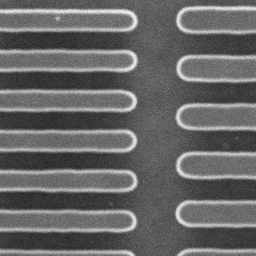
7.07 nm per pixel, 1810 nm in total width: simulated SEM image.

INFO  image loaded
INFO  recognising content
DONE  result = groups of lines, slits or small figures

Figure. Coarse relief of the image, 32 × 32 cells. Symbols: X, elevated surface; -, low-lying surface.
--------------------------------
XXXXXXXXXXXXXXXX-------XXXXXXXXX
XXXXXXXXXXXXXXXXX-----XXXXXXXXXX
XXXXXXXXXXXXXXXX-------XXXXXXXXX
--------------------------------
--------------------------------
XXXXXXXXXXXXXXXX----------------
XXXXXXXXXXXXXXXXX------XXXXXXXXX
XXXXXXXXXXXXXXXX------XXXXXXXXXX
-----------------------XXXXXXXXX
--------------------------------
XXXXXXXXXXXXXXXX----------------
XXXXXXXXXXXXXXXXX---------------
XXXXXXXXXXXXXXXXX------XXXXXXXXX
----------------------XXXXXXXXXX
----------------------XXXXXXXXXX
XXXXXXXX-XXXXXXX----------------
XXXXXXXXXXXXXXXXX---------------
XXXXXXXXXXXXXXXX----------------
-----------------------XXXXXXXXX
----------------------XXXXXXXXXX
XXXXXXXXXXXXXXXX-------XXXXXXXXX
XXXXXXXXXXXXXXXXX---------------
XXXXXXXXXXXXXXXXX---------------
--------------------------------
-----------------------XXXXXXXXX
XXXXXXXXXXXXXXXX------XXXXXXXXXX
XXXXXXXXXXXXXXXXX-----XXXXXXXXXX
XXXXXXXXXXXXXXXXX---------------
--------------------------------
--------------------------------
XXXXXXX---XXX----------XXXXXXXXX